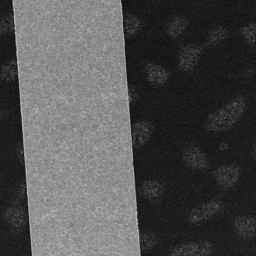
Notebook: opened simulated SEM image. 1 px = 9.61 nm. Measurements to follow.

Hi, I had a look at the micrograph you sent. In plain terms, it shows one or a few lines or trenches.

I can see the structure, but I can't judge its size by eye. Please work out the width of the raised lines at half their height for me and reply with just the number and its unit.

1030 nm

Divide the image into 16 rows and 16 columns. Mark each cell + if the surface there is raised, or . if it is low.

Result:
.+++++++........
.+++++++........
.+++++++........
.+++++++........
.+++++++........
.+++++++........
.+++++++........
.+++++++........
.+++++++........
..++++++........
..++++++........
..++++++........
..+++++++.......
..+++++++.......
..+++++++.......
..+++++++.......